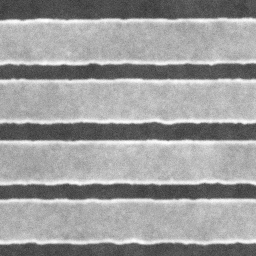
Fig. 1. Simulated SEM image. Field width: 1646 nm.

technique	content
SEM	lines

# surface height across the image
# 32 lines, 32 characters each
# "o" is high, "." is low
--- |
................................
................................
....ooo......oo.ooooo.oooooooooo
oooooooooooooooooooooooooooooooo
oooooooooooooooooooooooooooooooo
oooooooooooooooooooooooooooooooo
oooooooooooooooooooooooooooooooo
oooooooooooooooooooooooooooooooo
................................
................................
oooooooooooooooooooooooooooooooo
oooooooooooooooooooooooooooooooo
oooooooooooooooooooooooooooooooo
oooooooooooooooooooooooooooooooo
oooooooooooooooooooooooooooooooo
................................
................................
................................
oooooooooooooooooooooooooooooooo
oooooooooooooooooooooooooooooooo
oooooooooooooooooooooooooooooooo
oooooooooooooooooooooooooooooooo
oooooooooooooooooooooooooooooooo
................................
................................
oooooooooooooooooooooooooooooooo
oooooooooooooooooooooooooooooooo
oooooooooooooooooooooooooooooooo
oooooooooooooooooooooooooooooooo
oooooooooooooooooooooooooooooooo
................................
................................